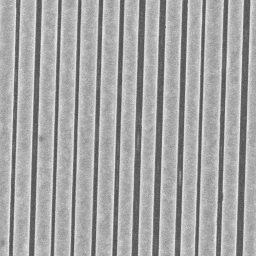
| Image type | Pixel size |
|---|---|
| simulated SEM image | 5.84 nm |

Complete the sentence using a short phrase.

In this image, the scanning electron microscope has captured parallel lines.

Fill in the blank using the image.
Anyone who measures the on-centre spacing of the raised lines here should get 0.121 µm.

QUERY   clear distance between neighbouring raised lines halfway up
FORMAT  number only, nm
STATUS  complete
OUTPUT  31.4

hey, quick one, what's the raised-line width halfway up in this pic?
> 94.2 nanometers